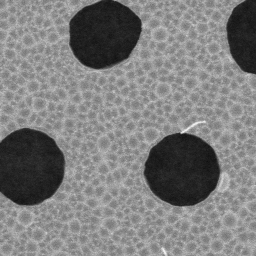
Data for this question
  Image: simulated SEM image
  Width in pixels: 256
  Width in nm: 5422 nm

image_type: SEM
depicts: holes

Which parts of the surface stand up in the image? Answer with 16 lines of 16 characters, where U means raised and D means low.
UUUUUDDDUUUUUUUD
UUUUDDDDDUUUUUDD
UUUUDDDDDUUUUUDD
UUUUUDDDUUUUUUDD
UUUUUUUUUUUUUUUD
UUUUUUUUUUUUUUUU
UUUUUUUUUUUUUUUU
UUUUUUUUUUUUUUUU
DDDUUUUUUUUDUUUU
DDDDUUUUUDDDDUUU
DDDDUUUUUDDDDDUU
DDDDUUUUUDDDDDUU
UDDUUUUUUUDDDUUU
UUUUUUUUUUUUUUUU
UUUUUUUUUUUUUUUU
UUUUUUUUUUUUUUUU